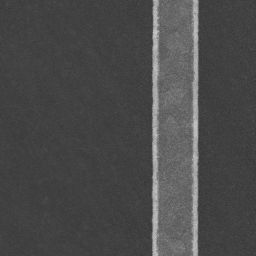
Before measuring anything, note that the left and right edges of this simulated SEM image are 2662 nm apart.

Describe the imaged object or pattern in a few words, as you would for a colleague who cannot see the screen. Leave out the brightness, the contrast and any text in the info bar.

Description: one or a few lines or trenches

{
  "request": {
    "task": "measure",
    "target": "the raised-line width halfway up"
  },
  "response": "408 nm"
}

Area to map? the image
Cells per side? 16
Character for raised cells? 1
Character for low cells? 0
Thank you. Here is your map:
0000000000110000
0000000000110000
0000000000110000
0000000000110000
0000000000110000
0000000000110000
0000000000110000
0000000000110000
0000000000110000
0000000000110000
0000000000110000
0000000000110000
0000000000110000
0000000000110000
0000000000110000
0000000000110000